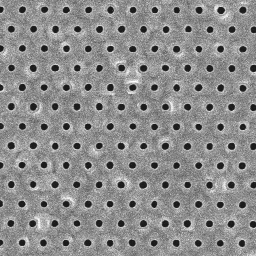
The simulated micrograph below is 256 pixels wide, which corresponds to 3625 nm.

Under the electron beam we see a regular array of holes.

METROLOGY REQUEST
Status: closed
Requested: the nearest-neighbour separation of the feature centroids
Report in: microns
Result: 0.309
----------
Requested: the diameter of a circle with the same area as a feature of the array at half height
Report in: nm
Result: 99.8